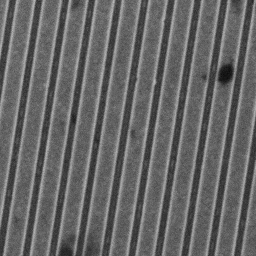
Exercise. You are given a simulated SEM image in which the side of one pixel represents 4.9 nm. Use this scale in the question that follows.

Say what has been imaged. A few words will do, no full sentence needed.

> parallel lines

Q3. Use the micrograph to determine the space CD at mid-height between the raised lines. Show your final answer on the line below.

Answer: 0.0357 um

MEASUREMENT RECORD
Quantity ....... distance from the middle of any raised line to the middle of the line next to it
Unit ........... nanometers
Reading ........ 128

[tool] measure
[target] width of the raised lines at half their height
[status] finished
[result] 93.8 nm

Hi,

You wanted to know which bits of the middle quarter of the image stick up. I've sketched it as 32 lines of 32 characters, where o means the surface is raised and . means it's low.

ooo..ooooo..ooooo..oooo..ooooo..
ooo..ooooo..ooooo..oooo..ooooo..
ooo..ooooo..oooo..ooooo..ooooo..
ooo..ooooo..oooo..ooooo..oooo..o
ooo..oooo..ooooo..ooooo..oooo..o
ooo..oooo..ooooo..ooooo..oooo..o
oo..ooooo..ooooo..oooo..ooooo..o
oo..ooooo..ooooo..oooo..ooooo..o
oo..ooooo..oooo..ooooo..ooooo..o
oo..ooooo..oooo..ooooo..oooo..oo
oo..oooo..ooooo..ooooo..oooo..oo
oo..oooo..ooooo..ooooo..oooo..oo
o..ooooo..ooooo..ooooo..oooo..oo
o..ooooo..ooooo..oooo..ooooo..oo
o..ooooo..ooooo..oooo..ooooo..oo
o..ooooo..oooo..ooooo..ooooo..oo
o..ooooo..oooo..ooooo..oooo..ooo
o..oooo..ooooo..ooooo..oooo..ooo
o..oooo..ooooo..ooooo..oooo..ooo
..ooooo..ooooo..oooo..ooooo..ooo
..ooooo..ooooo..oooo..ooooo..ooo
..ooooo..oooo..ooooo..ooooo..ooo
..ooooo..oooo..ooooo..oooo..oooo
..oooo..ooooo..ooooo..oooo..oooo
..oooo..ooooo..ooooo..oooo..oooo
..oooo..ooooo..ooooo..oooo..oooo
..oooo..ooooo..oooo..ooooo..oooo
.ooooo..ooooo..oooo..ooooo..oooo
.ooooo..oooo..ooooo..ooooo.ooooo
.ooooo..oooo..ooooo..oooo..ooooo
.oooo..ooooo..ooooo..oooo..ooooo
.oooo..ooooo..ooooo..oooo..ooooo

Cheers